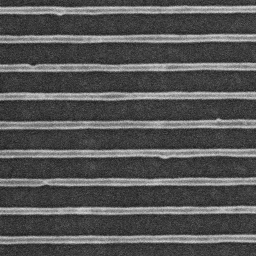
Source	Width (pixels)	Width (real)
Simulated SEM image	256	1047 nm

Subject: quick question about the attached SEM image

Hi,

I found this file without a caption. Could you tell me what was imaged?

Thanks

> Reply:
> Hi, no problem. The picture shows parallel lines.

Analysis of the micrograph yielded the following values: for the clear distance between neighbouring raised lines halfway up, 22.6 px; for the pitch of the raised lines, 117 nm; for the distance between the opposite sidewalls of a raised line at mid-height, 26.6 nm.